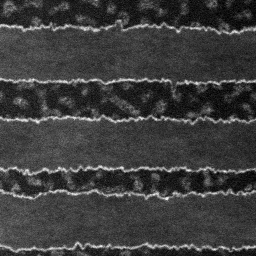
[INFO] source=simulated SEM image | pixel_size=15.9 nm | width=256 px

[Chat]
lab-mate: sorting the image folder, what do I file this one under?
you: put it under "one or a few lines or trenches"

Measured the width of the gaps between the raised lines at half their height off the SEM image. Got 840 nm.